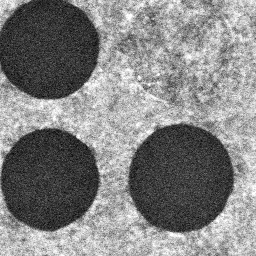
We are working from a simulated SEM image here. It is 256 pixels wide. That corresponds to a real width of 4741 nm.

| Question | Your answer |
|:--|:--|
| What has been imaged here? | holes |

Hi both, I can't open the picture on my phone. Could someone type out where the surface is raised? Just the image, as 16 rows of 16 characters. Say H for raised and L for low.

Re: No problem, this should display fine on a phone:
HLLLLHHHHHHHHHHH
LLLLLLHHHHHHHHHH
LLLLLLHHHHHHHHHH
LLLLLLHHHHHHHHHH
LLLLLLHHHHHHHHHH
HLLLLHHHHHHHHHHH
HHHHHHHHHHHHHHHH
HHHHHHHHHHHHHHHH
HLLLLHHHHLLLLHHH
HLLLLLHHLLLLLLHH
LLLLLLHHLLLLLLLH
LLLLLLHHLLLLLLLH
LLLLLLHHLLLLLLHH
HLLLLHHHHLLLLLHH
HHHHHHHHHHHLHHHH
HHHHHHHHHHHHHHHH